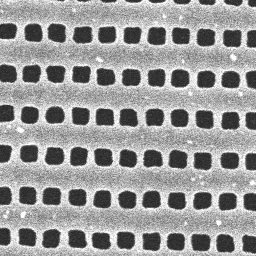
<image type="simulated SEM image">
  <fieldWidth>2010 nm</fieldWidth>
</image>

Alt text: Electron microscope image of a regular array of holes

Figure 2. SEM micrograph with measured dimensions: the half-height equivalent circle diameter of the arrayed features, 0.15 um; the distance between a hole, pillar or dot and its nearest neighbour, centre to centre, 0.192 µm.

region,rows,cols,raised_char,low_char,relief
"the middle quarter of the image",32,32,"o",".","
ooo...oooooooooooooooooooooooooo
oo.....o....ooo...oooo...ooo..oo
oo.....o.....o.....oo....oo....o
oo....oo.....o.....oo....oo....o
oo....oo.....o.....oo....oo....o
ooooooooo.ooooo...ooo....oo....o
oooooooooooooooooooooooooooooooo
oooooooooooooooooooooooooooooooo
oooooooooooooooooooooooooooooooo
oooooooooooooooooooooooooooooooo
oooooooooooooooooooooooooooooooo
oo....oo....oo...oooo....ooo..oo
oo....oo.....o....oo.....oo....o
oo....oo.....o....oo.....oo....o
oo....oo.....o.....o.....oo....o
oooooooooo..ooo...ooooooooo....o
oooooooooooooooooooooooooooooooo
oooooooooooooooooooooooooooooooo
oooooooooooooooooooooooooooooooo
oooooooooooooooooooooooooooooooo
oooooooooooooooooooooooooooooooo
oo....oo....ooo.ooooo..oooo.oooo
oo....o.....oo....oo....oo.....o
oo....o.....oo....oo.....o.....o
o.....oo....oo....oo.....o.....o
oo.oooooo..ooo....oo....oo.....o
oooooooooooooooooooooooooooooooo
oooooooooooooooooooooooooooooooo
oooooooooooooooooooooooooooooooo
oooooooooooooooooooooooooooooooo
oooooooooooooooooooooooooooooooo
oo...ooooo.ooooooooooooooooooooo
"